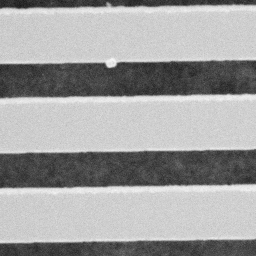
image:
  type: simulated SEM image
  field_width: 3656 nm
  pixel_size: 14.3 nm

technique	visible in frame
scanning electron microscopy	lines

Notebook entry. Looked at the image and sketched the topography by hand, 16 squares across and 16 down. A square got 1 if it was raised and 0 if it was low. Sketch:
0000001111111111
1111111111111111
1111111111111111
1111111111111111
0000000000000000
0000000000000000
1111111111111111
1111111111111111
1111111111111111
1100000000000000
0000000000000000
0000000000000000
1111111111111111
1111111111111111
1111111111111111
0000000000000000